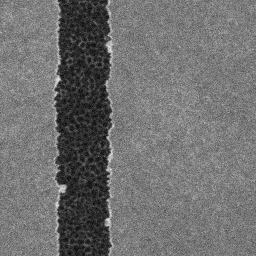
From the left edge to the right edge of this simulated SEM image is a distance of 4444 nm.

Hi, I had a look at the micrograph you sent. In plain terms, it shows one or a few lines or trenches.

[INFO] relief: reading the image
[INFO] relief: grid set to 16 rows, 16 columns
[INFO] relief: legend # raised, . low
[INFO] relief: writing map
####...#########
####...#########
####...#########
####...#########
####...#########
###....#########
###....#########
###....#########
####...#########
####...#########
####...#########
####...#########
####...#########
####...#########
####...#########
####...#########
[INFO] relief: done